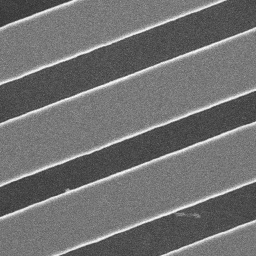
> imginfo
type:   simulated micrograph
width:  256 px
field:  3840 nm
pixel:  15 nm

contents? lines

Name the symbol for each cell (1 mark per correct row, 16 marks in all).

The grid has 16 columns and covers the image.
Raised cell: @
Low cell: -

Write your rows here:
---@@@@@@@@@@---
-@@@@@@@@@------
@@@@@@@@------@@
@@@@@------@@@@@
@@-------@@@@@@@
------@@@@@@@@@@
---@@@@@@@@@@@--
-@@@@@@@@@@-----
@@@@@@@@-----@@@
@@@@@@-----@@@@@
@@@-----@@@@@@@@
------@@@@@@@@@@
---@@@@@@@@@@---
@@@@@@@@@@------
@@@@@@@@------@@
@@@@@------@@@@@